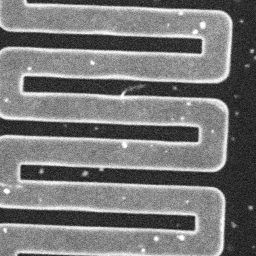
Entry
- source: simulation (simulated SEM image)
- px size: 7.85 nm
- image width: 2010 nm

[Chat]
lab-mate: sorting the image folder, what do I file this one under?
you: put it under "groups of lines, slits or small figures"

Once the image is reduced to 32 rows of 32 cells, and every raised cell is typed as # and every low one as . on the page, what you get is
####............................
############################....
#############################...
#############################...
..................###########...
.........................####...
################.........####...
#############################...
#############################...
###....#####################....
###.............................
###.............................
###########################.....
############################....
############################....
...............#############....
.........................###....
###############..........###....
############################....
############################....
############################....
##..............................
###.............................
##########################......
############################....
############################....
................############....
.........................###....
##########..............####....
############################....
############################....
############################....